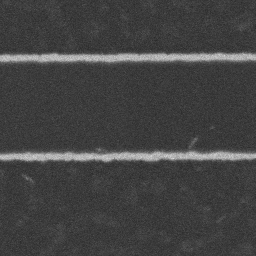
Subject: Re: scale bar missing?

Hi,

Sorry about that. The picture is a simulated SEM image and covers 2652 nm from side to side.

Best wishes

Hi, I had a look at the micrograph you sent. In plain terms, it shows one or a few lines or trenches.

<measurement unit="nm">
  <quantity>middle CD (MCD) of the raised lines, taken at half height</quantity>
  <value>1030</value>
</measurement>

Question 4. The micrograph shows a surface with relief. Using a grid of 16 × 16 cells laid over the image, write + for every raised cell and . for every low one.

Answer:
................
................
................
.............+..
++++++++++++++++
++++++++++++++++
++++++++++++++++
++++++++++++++++
++++++++++++++++
++++++++++++++++
................
................
................
................
................
................